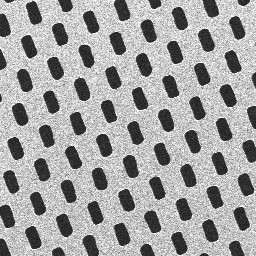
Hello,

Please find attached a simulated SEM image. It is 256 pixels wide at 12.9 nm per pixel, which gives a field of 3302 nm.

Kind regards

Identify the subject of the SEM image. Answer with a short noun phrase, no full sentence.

a regular array of holes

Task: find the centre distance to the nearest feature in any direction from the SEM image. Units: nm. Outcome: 430